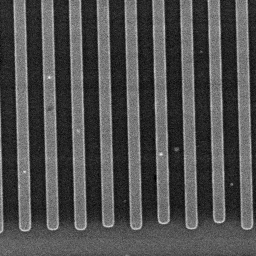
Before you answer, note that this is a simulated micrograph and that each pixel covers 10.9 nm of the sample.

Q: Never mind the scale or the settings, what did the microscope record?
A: groups of lines, slits or small figures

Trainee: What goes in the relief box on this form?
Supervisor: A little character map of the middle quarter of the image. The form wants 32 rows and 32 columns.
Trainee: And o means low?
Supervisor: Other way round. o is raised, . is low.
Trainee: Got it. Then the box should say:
..oo.....oo.....oo.....oo.....oo
..ooo....oo.....oo.....oo.....oo
..ooo....oo.....ooo....oo.....oo
..ooo....oo.....ooo....oo.....oo
..ooo....oo.....ooo....oo.....oo
..ooo....oo.....ooo....oo.....oo
..ooo....ooo....ooo....ooo....oo
..ooo....ooo....ooo....ooo....oo
..ooo....ooo....ooo....ooo....oo
..ooo....ooo....ooo....ooo....oo
..ooo....ooo....ooo....ooo....oo
..ooo....ooo....ooo....ooo....oo
..ooo....ooo....ooo....ooo....oo
..ooo....ooo....ooo....ooo....oo
..ooo....ooo....ooo....ooo....oo
..ooo....ooo....ooo....ooo....oo
..ooo....ooo....ooo....ooo....oo
..ooo....ooo....ooo....ooo....oo
..ooo....ooo....ooo....ooo....oo
..ooo....ooo....ooo....ooo....oo
..ooo....ooo....ooo....ooo....oo
..ooo....ooo....ooo....ooo....oo
..ooo....ooo....ooo....ooo....oo
..ooo....ooo....ooo....ooo....oo
..ooo....ooo....ooo....ooo....oo
..ooo....ooo....ooo....ooo....oo
...oo....ooo....ooo....ooo....oo
...oo....ooo....ooo....ooo....oo
...oo....ooo....ooo....ooo....oo
...oo....ooo....ooo....ooo....oo
...oo....ooo....ooo....ooo....oo
...oo.....oo....ooo.....oo....oo